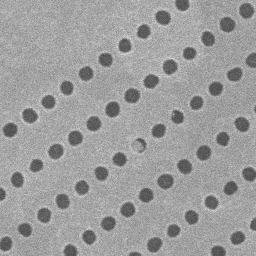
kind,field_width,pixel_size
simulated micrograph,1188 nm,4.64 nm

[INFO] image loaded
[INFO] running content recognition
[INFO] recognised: a regular array of holes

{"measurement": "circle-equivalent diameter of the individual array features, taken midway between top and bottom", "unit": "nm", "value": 71.2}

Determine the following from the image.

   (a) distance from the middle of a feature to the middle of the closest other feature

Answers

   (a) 109 nm